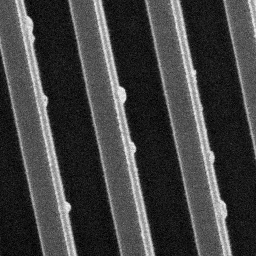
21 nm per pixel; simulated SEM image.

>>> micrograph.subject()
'lines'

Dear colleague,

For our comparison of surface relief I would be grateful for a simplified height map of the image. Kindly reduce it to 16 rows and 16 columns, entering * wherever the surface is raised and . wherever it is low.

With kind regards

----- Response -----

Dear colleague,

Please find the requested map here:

**..**...**...**
**...**..**...**
**...**...**...*
**...**...**...*
**...**...**...*
.**..***..**...*
.**...**...**..*
.**...**...**...
.**...**...**...
.**...**...**...
..**...**..**...
..**...**...*...
..**...**...**..
..**...**...**..
..**...**...**..
...**..**...**..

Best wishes